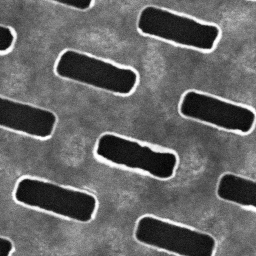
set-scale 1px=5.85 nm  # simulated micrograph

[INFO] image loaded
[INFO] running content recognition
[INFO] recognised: holes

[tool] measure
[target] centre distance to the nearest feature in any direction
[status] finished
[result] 0.538 um